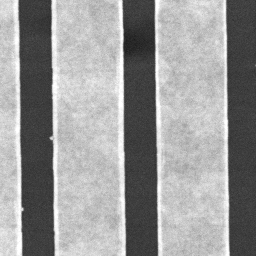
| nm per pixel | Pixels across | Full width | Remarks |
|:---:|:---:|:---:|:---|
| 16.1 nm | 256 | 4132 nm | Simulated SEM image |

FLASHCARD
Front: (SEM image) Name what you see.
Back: wiring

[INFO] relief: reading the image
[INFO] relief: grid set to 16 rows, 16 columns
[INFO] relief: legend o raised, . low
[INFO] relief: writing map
o..ooooo..oooo..
o..ooooo..oooo..
o..ooooo..oooo..
o..ooooo..oooo..
o..ooooo..oooo..
o..ooooo..oooo..
o..ooooo..oooo..
o..ooooo..oooo..
o...oooo..oooo..
o...oooo..oooo..
o..ooooo..oooo..
o...oooo..oooo..
o...oooo..oooo..
o...oooo..oooo..
o...oooo..oooo..
o...oooo..oooo..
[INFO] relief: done